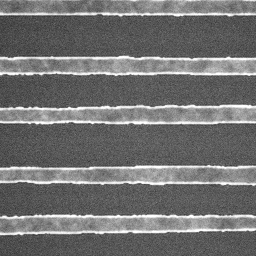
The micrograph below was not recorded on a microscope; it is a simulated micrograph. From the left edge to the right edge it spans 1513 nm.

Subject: lines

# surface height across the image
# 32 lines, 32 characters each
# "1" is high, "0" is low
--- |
11111111111111111111111111111111
11111111111111111111111111111111
00000000000000000000000000000000
00000000000000000000000000000000
00000000000000000000000000000000
00000000000000000000000000000000
00000000000000000000000000000000
11111111111111111111111111111111
11111111111111111111111111111111
00000000000000000000000000000000
00000000000000000000000000000000
00000000000000000000000000000000
00000000000000000000000000000000
00110000001111111111111111111111
11111111111111111111111111111111
00000000000000000000000000000000
00000000000000000000000000000000
00000000000000000000000000000000
00000000000000000000000000000000
00000000000000000000000000000000
00000000000000000000000000000000
11111111111111111111111111111111
11111111111111111111111111111111
00000000000000000000000000000000
00000000000000000000000000000000
00000000000000000000000000000000
00000000000000000000000000000000
11111111111111111111111111111111
11111111111111111111111111111111
00000000000000000000000000000000
00000000000000000000000000000000
00000000000000000000000000000000